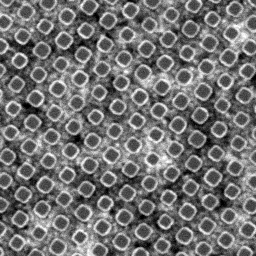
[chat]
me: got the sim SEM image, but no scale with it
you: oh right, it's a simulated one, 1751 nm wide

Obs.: a regular array of raised bodies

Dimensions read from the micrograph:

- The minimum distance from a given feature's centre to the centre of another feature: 162 nm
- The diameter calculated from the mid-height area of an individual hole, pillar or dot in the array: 104 nm